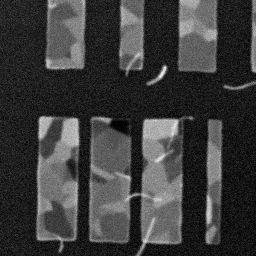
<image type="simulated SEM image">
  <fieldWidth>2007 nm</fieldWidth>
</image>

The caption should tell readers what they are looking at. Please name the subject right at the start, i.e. groups of lines, slits or small figures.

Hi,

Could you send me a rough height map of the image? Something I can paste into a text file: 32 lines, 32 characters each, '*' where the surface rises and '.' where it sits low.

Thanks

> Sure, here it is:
......*****....***.....****.....
......*****....***....*****.....
......*****....***....*****.....
......*****....***....*****.....
......****.....***.....****.....
......*****....***....*****.....
......*****....***....*****.....
......****.....***....*****.....
......****.....***.....****.....
................................
................................
................................
................................
................................
................................
.....*****.*****..*****...**....
.....*****..****..*****...**....
.....*****..****..*****...**....
.....*****.*****..*****...**....
.....*****.*****..*****...**....
.....*****.*****..*****...**....
.....*****.*****..*****...**....
.....*****.*****..*****...**....
.....*****.*****..*****...**....
.....*****.*****..*****...**....
.....*****.*****..*****...*.....
.....*****.*****..*****...*.....
.....****..*****..*****...*.....
.....****..*****..*****...*.....
.....****..*****..*****...*.....
................................
................................